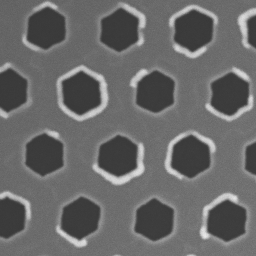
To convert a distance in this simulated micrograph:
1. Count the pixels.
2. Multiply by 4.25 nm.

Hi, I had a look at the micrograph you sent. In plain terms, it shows a regular array of holes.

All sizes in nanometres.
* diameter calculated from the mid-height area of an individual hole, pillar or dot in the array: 170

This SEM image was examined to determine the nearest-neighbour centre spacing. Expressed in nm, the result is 308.